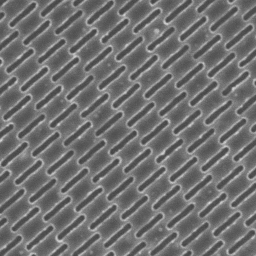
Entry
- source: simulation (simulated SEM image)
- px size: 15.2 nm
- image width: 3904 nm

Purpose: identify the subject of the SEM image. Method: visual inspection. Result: a regular array of holes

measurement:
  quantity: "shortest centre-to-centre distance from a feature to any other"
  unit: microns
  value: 0.352